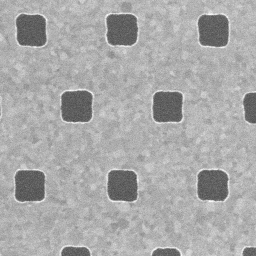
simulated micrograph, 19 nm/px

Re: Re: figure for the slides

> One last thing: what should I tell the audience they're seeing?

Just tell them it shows a regular array of holes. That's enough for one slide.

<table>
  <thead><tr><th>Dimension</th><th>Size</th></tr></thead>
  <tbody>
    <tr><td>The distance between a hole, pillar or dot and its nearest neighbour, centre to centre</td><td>1700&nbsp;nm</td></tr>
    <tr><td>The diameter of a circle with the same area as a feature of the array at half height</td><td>0.659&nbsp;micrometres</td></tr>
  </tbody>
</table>